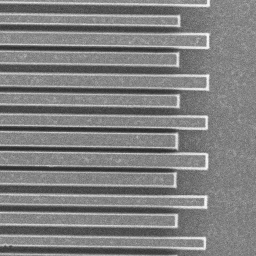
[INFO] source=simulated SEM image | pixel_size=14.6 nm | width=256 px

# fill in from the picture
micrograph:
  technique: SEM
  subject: parallel lines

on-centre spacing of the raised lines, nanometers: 294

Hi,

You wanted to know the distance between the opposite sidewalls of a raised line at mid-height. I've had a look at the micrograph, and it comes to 0.191 microns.